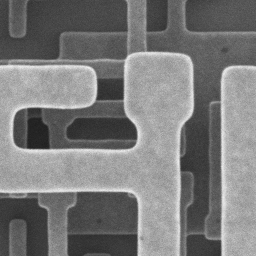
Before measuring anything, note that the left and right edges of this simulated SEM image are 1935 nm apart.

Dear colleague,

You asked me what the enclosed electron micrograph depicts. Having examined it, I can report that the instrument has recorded wiring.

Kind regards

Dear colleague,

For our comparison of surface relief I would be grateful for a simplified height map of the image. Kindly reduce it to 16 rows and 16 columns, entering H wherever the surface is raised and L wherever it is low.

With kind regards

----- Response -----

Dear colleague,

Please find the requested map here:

LLLLLLLLLLLLLLLL
LLLLLLLLLLLLLLLL
LLLLLLLLLLLLLLLL
LLLLLLLLHHHHLLLL
HHHHHHLLHHHHLLHH
HHHHHHLLHHHHLLHH
HHHHHHLLHHHHLLHH
HLLLLLLLHHHHLLHH
HLLLLLLLLHHLLLHH
HHHHHHHHHHHLLLHH
HHHHHHHHHHHLLLHH
HHHHHHHHHHHLLLHH
LLLLLLLLLHHLLLHH
LLLLLLLLLHHLLLHH
LLLLLLLLLHHLLLHH
LLLLLLLLLHHLLLHH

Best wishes